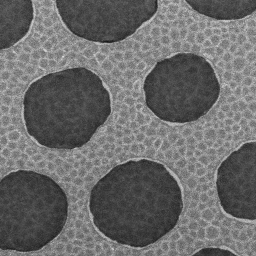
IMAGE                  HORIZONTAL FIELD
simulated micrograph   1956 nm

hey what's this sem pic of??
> holes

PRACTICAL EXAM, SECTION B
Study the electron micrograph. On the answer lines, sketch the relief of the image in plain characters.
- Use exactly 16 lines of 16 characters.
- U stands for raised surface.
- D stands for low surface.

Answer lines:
DDUUDDDDDDUUDDDD
DDUUDDDDDUUUUUUU
DUUUUDDDUUUUUUUU
UUUUUUUUUUUDUUUU
UUUDDDUUUDDDDUUU
UUDDDDDUUDDDDDUU
UDDDDDDUUDDDDUUU
UDDDDDDUUUDDUUUU
UUDDDDUUUUUUUUUU
UUUUUUUUUUUUUUDD
UUUUUUUDDDUUUUDD
DDDDUUDDDDDUUUDD
DDDDUUDDDDDUUUDD
DDDDUUDDDDDUUUDD
DDDDUUDDDDDUUUUU
DDDUUUUUUUUUUDUU